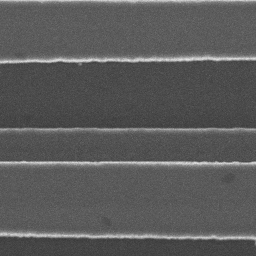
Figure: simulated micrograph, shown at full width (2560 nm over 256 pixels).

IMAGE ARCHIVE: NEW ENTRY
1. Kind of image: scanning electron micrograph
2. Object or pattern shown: lines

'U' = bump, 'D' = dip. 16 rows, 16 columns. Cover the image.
UUUUUUUUUUUUUUUU
UUUUUUUUUUUUUUUU
UUUUUUUUUUUUUUUU
UUUUUUUUUUUUUUUU
DDDDDDDDDDDDDDDD
DDDDDDDDDDDDDDDD
DDDDDDDDDDDDDDDD
DDDDDDDDDDDDDDDD
UUUUUUUUUUUUUUUU
UUUUUUUUUUUUUUUU
UUUUUUUUUUUUUUUU
UUUUUUUUUUUUUUUU
UUUUUUUUUUUUUUUU
UUUUUUUUUUUUUUUU
UUUUUUUUUUUUUUUU
DDDDDDDDDDDDDDDD